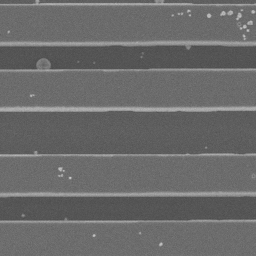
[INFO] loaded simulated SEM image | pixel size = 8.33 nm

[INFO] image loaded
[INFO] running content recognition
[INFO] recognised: lines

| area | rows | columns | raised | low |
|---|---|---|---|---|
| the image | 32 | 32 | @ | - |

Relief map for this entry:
-----@@@@@@@@@@@@@--@@@@--------
@@@@@@@@@@@@@@@@@@@@@@@@@@@@@@@@
@@@@@@@@@@@@@@@@@@@@@@@@@@@@@@@@
@@@@@@@@@@@@@@@@@@@@@@@@@@@@@@@@
@@@@@@@@@@@@@@@@@@@@@@@@@@@@@@@@
@@@@@@@@@@@@@@@@@@@@@@@@@@@@@@@@
--------------------------------
--------------------------------
--------------------------------
@@@@@@@@@@@@@@@@@@@@@@@@@@@@@@@@
@@@@@@@@@@@@@@@@@@@@@@@@@@@@@@@@
@@@@@@@@@@@@@@@@@@@@@@@@@@@@@@@@
@@@@@@@@@@@@@@@@@@@@@@@@@@@@@@@@
@@@@@@@@@@@@@@@@@@@@@@@@@@@@@@@@
--------------------------------
--------------------------------
--------------------------------
--------------------------------
--------------------------------
@@@@@@@@@@@@@@@@@@@@@@@@@@@@@@@@
@@@@@@@@@@@@@@@@@@@@@@@@@@@@@@@@
@@@@@@@@@@@@@@@@@@@@@@@@@@@@@@@@
@@@@@@@@@@@@@@@@@@@@@@@@@@@@@@@@
@@@@@@@@@@@@@@@@@@@@@@@@@@@@@@@@
@-------------------------------
--------------------------------
--------------------------------
--------------------------------
@@@@@@@@@@@@@@@@@@@@@@@@@@@@@@@@
@@@@@@@@@@@@@@@@@@@@@@@@@@@@@@@@
@@@@@@@@@@@@@@@@@@@@@@@@@@@@@@@@
@@@@@@@@@@@@@@@@@@@@@@@@@@@@@@@@